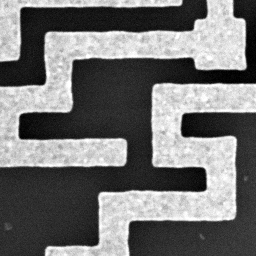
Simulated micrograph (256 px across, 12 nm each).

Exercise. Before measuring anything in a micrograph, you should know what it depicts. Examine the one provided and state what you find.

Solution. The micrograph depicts wiring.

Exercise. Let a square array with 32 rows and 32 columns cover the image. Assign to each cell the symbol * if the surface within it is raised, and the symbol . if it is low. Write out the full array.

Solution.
**********************....***...
**........................***...
**.......................*****..
**......................*******.
**....*************************.
**....*************************.
**....*************************.
*.....***...............*******.
......***................******.
......***.......................
......***.......................
*********..........*************
*********..........*************
*********..........*************
**.................****.........
**.................****.........
**.................****.........
****...*********...**********...
****************...**********...
****************...**********...
***************....**********...
..........................***...
..........................***...
..........................***...
............*****************...
............*****************...
............*****************...
............*****......*****....
............****................
............****................
............****................
......**********................